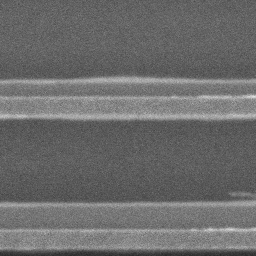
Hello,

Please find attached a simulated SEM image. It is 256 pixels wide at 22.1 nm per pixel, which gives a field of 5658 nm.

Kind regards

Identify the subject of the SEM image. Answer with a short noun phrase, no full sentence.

lines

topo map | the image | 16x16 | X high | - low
----------------
----------------
----------------
----------------
----------------
XXXXXXXXXXXXXXXX
XXXXXXXXXXXXXXXX
----------------
----------------
----------------
----------------
----------------
----------------
XXXXXXXXXXXXXXXX
XXXXXXXXXXXXXXXX
XXXXXXXXXXXXXXXX